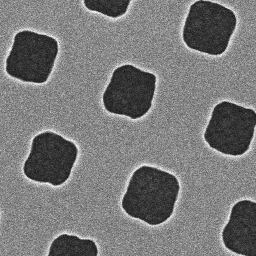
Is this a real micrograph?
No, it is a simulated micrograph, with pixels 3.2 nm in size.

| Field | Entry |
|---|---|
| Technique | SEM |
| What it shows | holes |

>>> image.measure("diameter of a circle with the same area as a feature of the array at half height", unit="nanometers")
166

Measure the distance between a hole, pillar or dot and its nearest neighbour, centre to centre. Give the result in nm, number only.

333